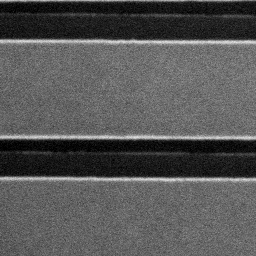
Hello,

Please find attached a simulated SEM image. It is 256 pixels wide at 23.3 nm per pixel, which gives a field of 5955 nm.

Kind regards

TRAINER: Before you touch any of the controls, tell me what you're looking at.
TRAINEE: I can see lines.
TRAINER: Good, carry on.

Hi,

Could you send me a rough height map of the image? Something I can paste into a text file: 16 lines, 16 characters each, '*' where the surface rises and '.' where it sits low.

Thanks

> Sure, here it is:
................
................
................
****************
****************
****************
****************
****************
****************
................
................
****************
****************
****************
****************
****************